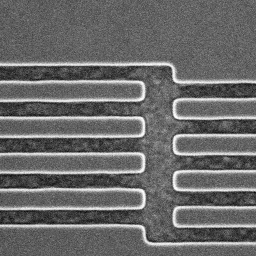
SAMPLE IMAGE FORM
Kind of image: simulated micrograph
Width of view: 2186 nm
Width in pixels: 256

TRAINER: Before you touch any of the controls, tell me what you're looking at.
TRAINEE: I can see groups of lines, slits or small figures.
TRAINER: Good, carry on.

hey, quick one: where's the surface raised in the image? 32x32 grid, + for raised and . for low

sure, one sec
++++++++++++++++++++++++++++++++
++++++++++++++++++++++++++++++++
++++++++++++++++++++++++++++++++
++++++++++++++++++++++++++++++++
++++++++++++++++++++++++++++++++
++++++++++++++++++++++++++++++++
++++++++++++++++++++++++++++++++
++++++++++++++++++++++++++++++++
.....................+++++++++++
......................++++++++++
++++++++++++++++++..............
++++++++++++++++++..............
++++++++++++++++++....++++++++++
......................++++++++++
......................++++++++++
++++++++++++++++++..............
++++++++++++++++++..............
......................++++++++++
......................++++++++++
++++++++++++++++++..............
++++++++++++++++++..............
++++++++++++++++++....++++++++++
......................++++++++++
......................++++++++++
++++++++++++++++++..............
++++++++++++++++++..............
......................++++++++++
......................++++++++++
++++++++++++++++++..............
++++++++++++++++++..............
++++++++++++++++++++++++++++++++
++++++++++++++++++++++++++++++++